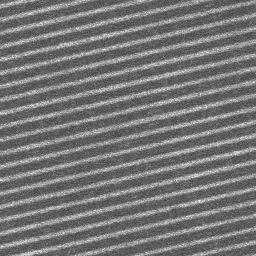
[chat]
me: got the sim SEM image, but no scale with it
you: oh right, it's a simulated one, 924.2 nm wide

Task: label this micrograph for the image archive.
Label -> parallel lines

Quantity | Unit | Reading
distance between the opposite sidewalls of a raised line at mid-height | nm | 15.4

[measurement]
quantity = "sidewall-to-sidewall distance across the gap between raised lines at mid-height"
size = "8.75 pixels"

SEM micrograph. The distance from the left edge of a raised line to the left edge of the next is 47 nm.